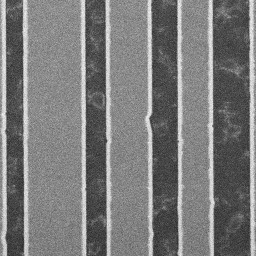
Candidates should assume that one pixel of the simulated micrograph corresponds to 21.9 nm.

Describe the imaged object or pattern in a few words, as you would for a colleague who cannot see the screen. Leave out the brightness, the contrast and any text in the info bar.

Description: one or a few lines or trenches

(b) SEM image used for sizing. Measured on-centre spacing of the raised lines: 1550 nm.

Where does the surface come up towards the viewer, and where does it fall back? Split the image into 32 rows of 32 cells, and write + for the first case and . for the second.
...+++++++...++++++...++++.....+
...+++++++...++++++...++++.....+
...+++++++....+++++...++++......
...+++++++....+++++...++++.....+
...+++++++....+++++...++++.....+
...+++++++....+++++...++++.....+
...+++++++....+++++...++++.....+
...+++++++....+++++...++++.....+
+..+++++++....+++++...++++.....+
+..+++++++....+++++...++++......
...+++++++....+++++...++++.....+
+..+++++++....+++++....+++.....+
+..+++++++....+++++....+++......
...+++++++....+++++....+++......
+..+++++++....+++++....+++.....+
+..+++++++....+++++....+++.....+
...+++++++....+++++....+++.....+
+..+++++++....+++++....+++.....+
+..+++++++....+++++....+++.....+
+..+++++++....+++++....+++......
+..+++++++....+++++....+++......
+..+++++++....+++++....+++......
+..+++++++....+++++....+++......
+..+++++++....+++++....+++......
+..+++++++....+++++...++++......
+..++++++++...+++++...+++++.....
+..++++++++...+++++...++++......
+..++++++++...+++++....+++......
+..++++++++...+++++...++++......
...++++++++...+++++....+++......
+..++++++++...+++++....+++......
+..++++++++...+++++...+++++.....